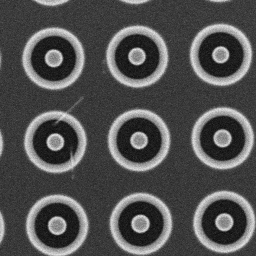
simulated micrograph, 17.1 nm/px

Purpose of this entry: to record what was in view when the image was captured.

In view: an array of small figures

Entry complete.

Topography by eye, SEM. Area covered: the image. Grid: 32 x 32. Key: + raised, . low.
++++++++++++++++++++++++++++++++
++++++++++++++++++++++++++++++++
++++++++++++++++++++++++++++++++
++++++++++++++++++++++++++++++++
+++++...+++++++....++++++.....++
++++.....+++++......+++++......+
++++..+...++++..++..++++...+...+
+++...++..++++..++..++++...+...+
++++......++++......+++++.....++
++++.....++++++....+++++++....++
++++++..++++++++++++++++++++++++
++++++++++++++++++++++++++++++++
++++++++++++++++++++++++++++++++
++++++++++++++++++++++++++++++++
++++++++++++++++...+++++++....++
+++++....++++++.....+++++......+
++++......++++......+++++..+...+
++++..++..++++..++...+++...++..+
++++..++..++++...+..+++++......+
++++......+++++.....+++++.....++
+++++....+++++++...++++++++..+++
++++++++++++++++++++++++++++++++
++++++++++++++++++++++++++++++++
++++++++++++++++++++++++++++++++
++++++++++++++++++++++++++++++++
+++++....++++++.....++++++....++
++++......+++++......++++......+
++++..++..++++...+...++++..++..+
++++..++..++++...+...++++..++..+
++++......+++++.....+++++......+
+++++....+++++++....++++++....++
++++++++++++++++++++++++++++++++